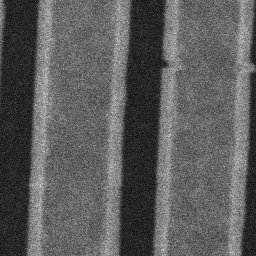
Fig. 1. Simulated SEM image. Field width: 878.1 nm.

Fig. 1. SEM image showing one or a few lines or trenches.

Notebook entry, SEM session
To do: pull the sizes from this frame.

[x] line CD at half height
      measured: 76.9 pixels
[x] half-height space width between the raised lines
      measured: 0.167 micrometres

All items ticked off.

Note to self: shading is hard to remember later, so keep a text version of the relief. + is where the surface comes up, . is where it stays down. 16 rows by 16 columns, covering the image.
...+++++...++++.
...+++++...++++.
...+++++...++++.
...+++++...++++.
...++++....++++.
...++++...+++++.
...++++...+++++.
..+++++...+++++.
..+++++...+++++.
..+++++...+++++.
..+++++...+++++.
..+++++...+++++.
..+++++...+++++.
..+++++...+++++.
..+++++...+++++.
..+++++...+++++.